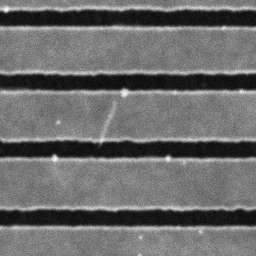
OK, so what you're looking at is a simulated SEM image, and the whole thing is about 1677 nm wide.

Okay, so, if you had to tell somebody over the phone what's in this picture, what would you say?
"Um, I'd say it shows lines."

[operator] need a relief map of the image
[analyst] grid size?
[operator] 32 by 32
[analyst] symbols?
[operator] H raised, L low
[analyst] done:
HHHHHHHHHHHHHHHHHHHHHHHHHHHHHHHH
LLLLLLLLLLLLLLLLLLLLLLLLLLLLLLLL
LLLLLLLLLLLLLLLLLLLLLLLLLLLLLLLL
HHHHHHHHHHHHHHHHHHHHHHHHHHHHHHHH
HHHHHHHHHHHHHHHHHHHHHHHHHHHHHHHH
HHHHHHHHHHHHHHHHHHHHHHHHHHHHHHHH
HHHHHHHHHHHHHHHHHHHHHHHHHHHHHHHH
HHHHHHHHHHHHHHHHHHHHHHHHHHHHHHHH
HHHHHHHHHHHHHHHHHHHHHHHHHHHHHHHH
LLLLLLLLLLLLLLLLLLLLLLLLLLLLLLLL
LLLLLLLLLLLLLLLLLLLLLLLLLLLLLLLL
HHHHHHHHHHHHHHHHHHHHHHHHHHHHHHHH
HHHHHHHHHHHHHHHHHHHHHHHHHHHHHHHH
HHHHHHHHHHHHHHHHHHHHHHHHHHHHHHHH
HHHHHHHHHHHHHHHHHHHHHHHHHHHHHHHH
HHHHHHHHHHHHHHHHHHHHHHHHHHHHHHHH
HHHHHHHHHHHHHHHHHHHHHHHHHHHHHHHH
HHHHHHHHHHHHHHHHHHHHHHHHHHHHHHHH
LLLLLLLLLLLLLLLLLLLLLLLLLLLLLLLL
LLLLLLLLLLLLLLLLLLLLLLLLLLLLLLLL
HHHHHHHHHHHHHHHHHHHHHHHHHHHHHHHH
HHHHHHHHHHHHHHHHHHHHHHHHHHHHHHHH
HHHHHHHHHHHHHHHHHHHHHHHHHHHHHHHH
HHHHHHHHHHHHHHHHHHHHHHHHHHHHHHHH
HHHHHHHHHHHHHHHHHHHHHHHHHHHHHHHH
HHHHHHHHHHHHHHHHHHHHHHHHHHHHHHHH
LLLLLLLLLLLLLLLLLLLLLLLLLLLLLLLL
LLLLLLLLLLLLLLLLLLLLLLLLLLLLLLLL
HHHHHHHHHHHHHHHHHHHHHHHHHHHHHHHH
HHHHHHHHHHHHHHHHHHHHHHHHHHHHHHHH
HHHHHHHHHHHHHHHHHHHHHHHHHHHHHHHH
HHHHHHHHHHHHHHHHHHHHHHHHHHHHHHHH